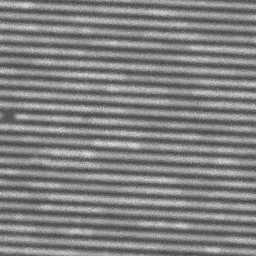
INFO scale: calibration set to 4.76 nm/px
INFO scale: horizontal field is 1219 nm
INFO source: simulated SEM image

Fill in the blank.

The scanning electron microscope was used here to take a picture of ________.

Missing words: parallel lines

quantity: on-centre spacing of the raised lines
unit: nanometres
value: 53.1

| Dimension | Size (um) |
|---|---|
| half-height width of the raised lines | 0.0226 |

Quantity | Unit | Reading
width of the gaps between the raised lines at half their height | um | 0.0273